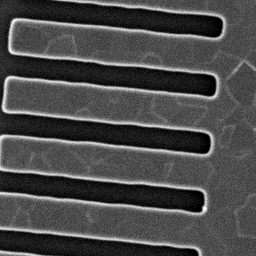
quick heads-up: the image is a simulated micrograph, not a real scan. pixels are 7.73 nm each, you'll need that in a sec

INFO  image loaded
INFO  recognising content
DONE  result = groups of lines, slits or small figures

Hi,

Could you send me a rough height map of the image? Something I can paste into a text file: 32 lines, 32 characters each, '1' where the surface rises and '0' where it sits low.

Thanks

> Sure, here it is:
00000000000011111111111111111111
00000000000000000000011111111111
00100000000000000000000000001111
01111111111111000000000000001111
01111111111111111111111110011111
01111111111111111111111111111111
00111111111111111111111111111111
00000000001111111111111111111111
00000000000000000001111111111111
00000000000000000000000000011111
01111111100000000000000000011111
01111111111111111110000000011111
11111111111111111111111111111111
11111111111111111111111111111111
00000011111111111111111111111111
00000000000000001111111111111111
00000000000000000000000000111111
11111111000000000000000000111111
11111111111111111000000000111111
11111111111111111111111111111111
11111111111111111111111111111111
00001111111111111111111111111111
00000000000011111111111111111111
00000000000000000000001111111111
11110000000000000000000000111111
11111111111111000000000000111111
11111111111111111111111101111111
11111111111111111111111111111111
11111111111111111111111111111111
00000000001111111111111111111111
00000000000000000001111111111111
10000000000000000000000001111111